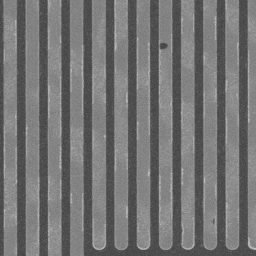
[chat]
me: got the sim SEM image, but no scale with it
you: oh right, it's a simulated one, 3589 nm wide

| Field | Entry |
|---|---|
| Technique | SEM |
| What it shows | parallel lines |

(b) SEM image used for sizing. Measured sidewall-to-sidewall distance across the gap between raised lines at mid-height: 128 nanometers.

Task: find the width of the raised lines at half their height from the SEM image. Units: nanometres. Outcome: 182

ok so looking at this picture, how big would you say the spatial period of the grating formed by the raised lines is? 310 nanometers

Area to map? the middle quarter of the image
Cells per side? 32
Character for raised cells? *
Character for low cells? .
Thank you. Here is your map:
..***..***...***..***...***..***
..***..**....***..***...***..***
..***..***...***..***...***..***
..***..***...***..***...***..***
..***..***...***..***...***..***
..***..***...***..***...***..***
..***..***...***..***...***..***
..***..***...***..***...***..***
..***..***...***..***...***..***
..***..***...***..***...***..***
..***..***...***..***...***..***
..***..***...***..***...***..***
..***..***...***..***...***..***
..***..***...***..***...***..***
..***..***...***..***...***..***
..***..***...***..****..***..***
..***..***...***..***...***..***
..***..***...***..***...***..***
..***..***...***..***...***..***
..***..***...***..***...***..***
..***..***...***..***...***..***
...**..***...***..***...***..***
....*..***...***..***...***..***
..*....***...***..***...***..***
..**...***...***..***...***..***
..***..***...***..***...***...**
..***..***...***..***...***...**
..***..***...***..***...***...**
..***..***...***..***...***...**
..***..***...***..***...***...**
..***..***...***..***...***...**
..***..***...***..***...***...**